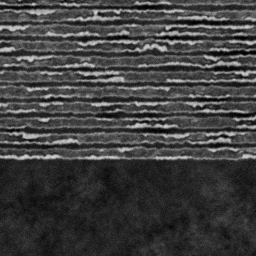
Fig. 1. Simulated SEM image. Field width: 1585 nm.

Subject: parallel lines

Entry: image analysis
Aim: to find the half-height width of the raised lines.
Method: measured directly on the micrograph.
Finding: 58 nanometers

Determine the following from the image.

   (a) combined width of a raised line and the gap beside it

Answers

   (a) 0.0951 um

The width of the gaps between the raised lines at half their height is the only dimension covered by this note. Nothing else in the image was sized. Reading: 0.0348 microns